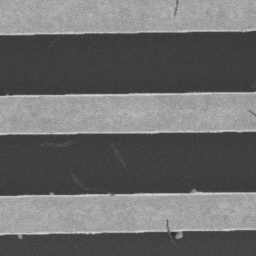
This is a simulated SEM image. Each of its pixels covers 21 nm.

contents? lines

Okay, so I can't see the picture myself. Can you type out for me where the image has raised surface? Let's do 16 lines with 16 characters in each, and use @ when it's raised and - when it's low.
@@@@@@@@@@@@@@@@
@@@@@@@@@@@@@@@@
----------------
----------------
----------------
----------------
@@@@@@@@@@@@@@@@
@@@@@@@@@@@@@@@@
----------------
----------------
----------------
----------------
@@@@@@@@@@@@@@@@
@@@@@@@@@@@@@@@@
@@@@@@@@@-@-----
----------------